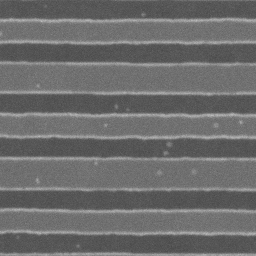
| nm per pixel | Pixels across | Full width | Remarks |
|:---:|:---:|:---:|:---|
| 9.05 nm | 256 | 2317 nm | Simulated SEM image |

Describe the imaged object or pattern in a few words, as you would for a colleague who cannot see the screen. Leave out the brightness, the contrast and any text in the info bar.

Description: lines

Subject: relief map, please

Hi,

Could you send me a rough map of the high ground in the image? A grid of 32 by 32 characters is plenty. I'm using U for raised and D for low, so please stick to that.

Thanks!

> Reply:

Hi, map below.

DDDDDDDDDDDDDDDDDDDDDDDDDDDDDDDD
DDDDDDDDDDDDDDDDDDDDDDDDDDDDDDDD
UUUUUUDUUUUUDDDUUUUUUUUUUUUUUUUU
UUUUUUUUUUUUUUUUUUUUUUUUUUUUUUUU
UUUUUUUUUUUUUUUUUUUUUUUUUUUUUUUU
DDDDDDDDDDDDDDDDDDDDDDDDDDDDDDDD
DDDDDDDDDDDDDDDDDDDDDDDDDDDDDDDD
DDDDDDDDDDDDDDDDDDDDDDDDDDDDDDDD
UUUUUUUUUUUUUUUUUUUUUUUUUUUUUUUU
UUUUUUUUUUUUUUUUUUUUUUUUUUUUUUUU
UUUUUUUUUUUUUUUUUUUUUUUUUUUUUUUU
UUUUUUUUUUUUUUUUUUUUUUUUUUUUUUUU
DDDDDDDDDDDDDDDDDDDDDDDDDDDDDDDD
DDDDDDDDDDDDDDDDDDDDDDDDDDDDDDDD
UUUUUUUUUUUUUUUUUUUUUUUUUUUUUUUU
UUUUUUUUUUUUUUUUUUUUUUUUUUUUUUUU
UUUUUUUUUUUUUUUUUUUUUUUUUUUUUUUU
DDDDDDDDDDDDDDDDDDDDDDDDDDDDDDDD
DDDDDDDDDDDDDDDDDDDDDDDDDDDDDDDD
DDDDDDDDDDDDDDDDDDDDDDDDDDDDDDDD
UUUUUUUUUUUUUUUUUUUUUUUUUUUUUUUU
UUUUUUUUUUUUUUUUUUUUUUUUUUUUUUUU
UUUUUUUUUUUUUUUUUUUUUUUUUUUUUUUU
UUUUUUUUUUUUUUUUUUUUUUUUUUUUUUUU
DDDDDDDDDDDDDDDDDDDDDDDDDDDDDDDD
DDDDDDDDDDDDDDDDDDDDDDDDDDDDDDDD
UUUUUUUUUUUUUUUUUUUUUUUUUUUUUUUU
UUUUUUUUUUUUUUUUUUUUUUUUUUUUUUUU
UUUUUUUUUUUUUUUUUUUUUUUUUUUUUUUU
DDDDDDDDDDDDDDDDDDDDDDDDDDDDDDDD
DDDDDDDDDDDDDDDDDDDDDDDDDDDDDDDD
DDDDDDDDDDDDDDDDDDDDDDDDDDDDDDDD